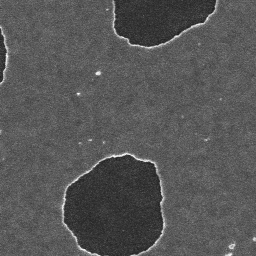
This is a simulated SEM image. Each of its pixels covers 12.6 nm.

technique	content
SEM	holes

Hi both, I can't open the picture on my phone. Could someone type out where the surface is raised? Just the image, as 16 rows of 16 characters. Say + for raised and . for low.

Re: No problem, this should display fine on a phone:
+++++++......+++
+++++++.....++++
++++++++...+++++
++++++++++++++++
++++++++++++++++
++++++++++++++++
++++++++++++++++
++++++++++++++++
++++++++++++++++
++++++++++++++++
++++++....++++++
+++++.....++++++
++++......++++++
++++......++++++
++++......++++++
+++++....+++++++